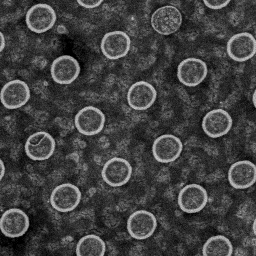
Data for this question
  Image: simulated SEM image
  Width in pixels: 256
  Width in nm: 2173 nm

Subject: a regular array of raised bodies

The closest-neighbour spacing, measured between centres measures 0.477 µm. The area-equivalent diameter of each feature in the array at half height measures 228 nanometers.